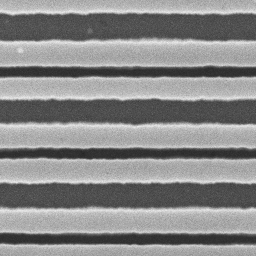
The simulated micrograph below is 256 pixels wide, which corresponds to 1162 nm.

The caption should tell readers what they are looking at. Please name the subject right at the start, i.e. lines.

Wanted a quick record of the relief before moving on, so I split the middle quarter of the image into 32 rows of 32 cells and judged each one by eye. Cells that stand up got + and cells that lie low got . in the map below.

++++++++++++++++++++++++++++++++
................................
................................
....+++++++++++++..+...++++++.+.
++++++++++++++++++++++++++++++++
++++++++++++++++++++++++++++++++
++++++++++++++++++++++++++++++++
++++++++++++++++++++++++++++++++
++++++++...+.+++++.+....++++++++
................................
................................
................................
................................
................................
................................
+++++++++++++++++..+++++++++++++
++++++++++++++++++++++++++++++++
++++++++++++++++++++++++++++++++
++++++++++++++++++++++++++++++++
++++++++++++++++++++++++++++++++
++++++++++++++++++++++++++++++++
................................
................................
................................
++++++++++++++++++++++++++++++++
++++++++++++++++++++++++++++++++
++++++++++++++++++++++++++++++++
++++++++++++++++++++++++++++++++
++++++++++++++++++++++++++++++++
.+++.+++++++..++...+++..+++.....
................................
................................